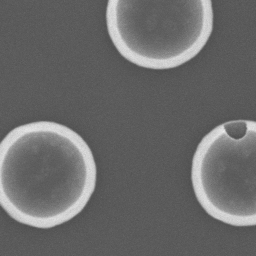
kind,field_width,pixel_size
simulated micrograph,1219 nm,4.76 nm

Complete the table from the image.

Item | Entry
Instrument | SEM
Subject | raised bodies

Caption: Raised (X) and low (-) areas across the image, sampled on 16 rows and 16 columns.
-------XXXXXX---
-------XXXXXX---
-------XXXXXX---
--------XXXX----
----------------
----------------
----------------
----------------
-XXX---------X-X
XXXXX--------XXX
XXXXXX------XXXX
XXXXXX------XXXX
XXXXX--------XXX
-XXX----------XX
----------------
----------------